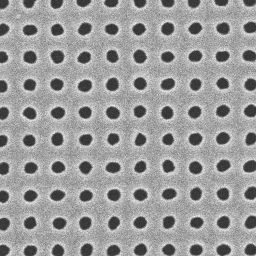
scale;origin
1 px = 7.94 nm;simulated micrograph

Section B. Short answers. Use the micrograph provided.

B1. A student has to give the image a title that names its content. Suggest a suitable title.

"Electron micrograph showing a regular array of holes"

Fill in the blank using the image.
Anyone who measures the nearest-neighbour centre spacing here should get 0.214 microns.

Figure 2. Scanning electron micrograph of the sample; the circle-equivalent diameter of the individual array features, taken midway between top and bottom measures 102 nm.